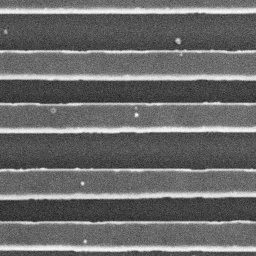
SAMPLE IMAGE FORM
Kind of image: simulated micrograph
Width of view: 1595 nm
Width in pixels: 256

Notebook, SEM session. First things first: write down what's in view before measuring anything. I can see lines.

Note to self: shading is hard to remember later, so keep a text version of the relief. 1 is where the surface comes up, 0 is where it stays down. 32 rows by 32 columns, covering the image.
11111111111111111111111111111111
11111111111111111111111100111100
00000000000000000000000000000000
00000000000000000000000000000000
00000000000000000000000000000000
00000000000000000000000000000000
11111111111111111111111111111111
11111111111111111111111111111111
11111111111111111111111111111111
11111111111111111111111111111111
00000000000000000000000000000000
00000000000000000000000000000000
00000000000000000000000000000000
11111111111111111111111111111111
11111111111111111111111111111111
11111111111111111111111111111111
00000000000000000000000000000000
00000000000000000000000000000000
00000000000000000000000000000000
00000000000000000000000000000000
00000000000000000000000000000000
11111111111111111111111111111111
11111111111111111111111111111111
11111111111111111111111111111111
11111111111111111111000001000000
00000000000000000000000000000000
00000000000000000000000000000000
00000000000000000000000000000000
11111111111111111111111111111111
11111111111111111111111111111111
11111111111111111111111111111111
00000000000000000000000000000000